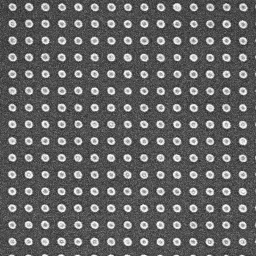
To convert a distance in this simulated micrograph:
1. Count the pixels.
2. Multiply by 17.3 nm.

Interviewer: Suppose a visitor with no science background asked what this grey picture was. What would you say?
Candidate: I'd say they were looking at a regular array of raised bodies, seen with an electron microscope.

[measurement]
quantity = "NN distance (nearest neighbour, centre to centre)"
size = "0.282 micrometres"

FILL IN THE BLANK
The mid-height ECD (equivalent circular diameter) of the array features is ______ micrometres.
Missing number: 0.122